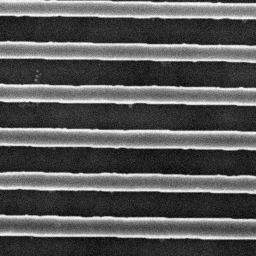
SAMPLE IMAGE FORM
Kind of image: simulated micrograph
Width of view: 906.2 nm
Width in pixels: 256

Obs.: lines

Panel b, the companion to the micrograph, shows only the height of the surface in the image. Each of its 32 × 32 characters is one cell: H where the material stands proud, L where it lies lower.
HHHHHHHHHHHHHHHHHHHHHHHHHHHHHHHH
HHHHHHHHHHHHHHHHHHHHHHHHHHHHHHHH
LLLLLLLLLLLLLLLLLLLLLLLLLLLLLLLL
LLLLLLLLLLLLLLLLLLLLLLLLLLLLLLLL
LLLLLLLLLLLLLLLLLLLLLLLLLLLLLLLL
HHHHHHHHHHHLLLLLLLLLLLLLLLLLLLLL
HHHHHHHHHHHHHHHHHHHHHHHHHHHHHHHH
LLLLLLLLLLLLLLLLLLLHHHHHHHHHHHHH
LLLLLLLLLLLLLLLLLLLLLLLLLLLLLLLL
LLLLLLLLLLLLLLLLLLLLLLLLLLLLLLLL
LLLLLLLLLLLLLLLLLLLLLLLLLLLLLLLL
HHHHHHHHHHHHHHHHHHHHHHHHHHHHHHHH
HHHHHHHHHHHHHHHHHHHHHHHHHHHHHHHH
LLLLLLLLLLLLLLLLLLLLLLLLLLLLLLLL
LLLLLLLLLLLLLLLLLLLLLLLLLLLLLLLL
LLLLLLLLLLLLLLLLLLLLLLLLLLLLLLLL
HHHHHHHHHHHHHHHHHHHHHHHHHLHHLLLL
HHHHHHHHHHHHHHHHHHHHHHHHHHHHHHHH
LLLLLLLLLLLLLLLLLLLLLLLLLHHHHHHH
LLLLLLLLLLLLLLLLLLLLLLLLLLLLLLLL
LLLLLLLLLLLLLLLLLLLLLLLLLLLLLLLL
LLLLLLLLLLLLLLLLLLLLLLLLLLLLLLLL
HHHHHHHHHHHHHHHHHHHHHHHHHHHHHHHH
HHHHHHHHHHHHHHHHHHHHHHHHHHHHHHHH
LLLLLLLLLLLLLLLLLLLLLLLLLLLLLLLL
LLLLLLLLLLLLLLLLLLLLLLLLLLLLLLLL
LLLLLLLLLLLLLLLLLLLLLLLLLLLLLLLL
HHHHHHHHHHHHHHHHHHHHHHHHHHHHHHHH
HHHHHHHHHHHHHHHHHHHHHHHHHHHHHHHH
LLLLHHHHHHHHHHHHHHHHHHHHHHHHHHHH
LLLLLLLLLLLLLLLLLLLLLLLLLLLLLLLL
LLLLLLLLLLLLLLLLLLLLLLLLLLLLLLLL